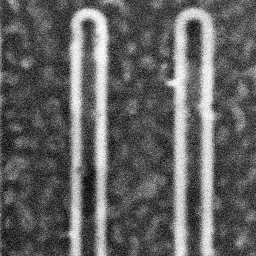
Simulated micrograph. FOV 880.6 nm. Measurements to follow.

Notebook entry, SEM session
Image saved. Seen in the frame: one or a few lines or trenches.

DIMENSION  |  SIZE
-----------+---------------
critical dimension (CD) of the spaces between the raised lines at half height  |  78 pixels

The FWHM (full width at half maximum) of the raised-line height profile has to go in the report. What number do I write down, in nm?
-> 91.6